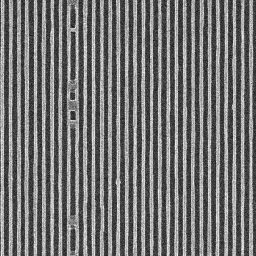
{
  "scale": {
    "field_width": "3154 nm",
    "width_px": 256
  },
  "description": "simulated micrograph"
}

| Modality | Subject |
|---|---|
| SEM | parallel lines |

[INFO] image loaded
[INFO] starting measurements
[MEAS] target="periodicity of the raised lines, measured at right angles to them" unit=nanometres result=102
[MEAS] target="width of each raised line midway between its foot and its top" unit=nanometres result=30.8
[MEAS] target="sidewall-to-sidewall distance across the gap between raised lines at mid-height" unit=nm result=72.4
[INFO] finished